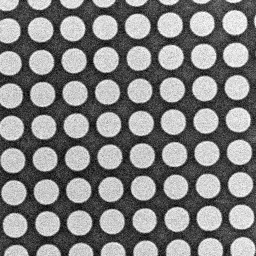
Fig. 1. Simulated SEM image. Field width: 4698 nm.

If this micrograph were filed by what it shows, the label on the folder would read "an array of small figures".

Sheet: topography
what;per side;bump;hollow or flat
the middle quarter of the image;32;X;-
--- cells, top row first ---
XXXXX---XXXXX---XXXXX----XXXX---
-XXX-----XXX--------------------
--------------------------------
--------------------------------
--XX-----XXX-----XXXX----XXXX---
XXXXX---XXXXX---XXXXXX--XXXXXX--
XXXXXX--XXXXXX--XXXXXX--XXXXXX--
XXXXXX--XXXXXX--XXXXXX--XXXXXX--
XXXXXX--XXXXX----XXXX----XXXX---
-XXXX----XXXX-----XX------------
--------------------------------
--------------------------------
----------XXX----XXXX----XXXXX--
-XXXX----XXXXX---XXXXX--XXXXXX--
XXXXXX--XXXXXX--XXXXXX--XXXXXX--
XXXXXX--XXXXXX--XXXXXX--XXXXXX--
XXXXXX---XXXXX---XXXXX---XXXXX--
-XXXX----XXXX-----XXX-----------
--------------------------------
--------------------------------
----------XXX-----XXX-----XXXX--
-XXXXX---XXXXX---XXXXX---XXXXX--
-XXXXX---XXXXX---XXXXXX--XXXXXX-
XXXXXX---XXXXX---XXXXX---XXXXXX-
XXXXXX---XXXXX---XXXXX---XXXXX--
-XXXXX----XXX-----XXX------XX---
---X----------------------------
--------------------------------
-----------XX-----XXX-----XXXX--
--XXXX---XXXXX---XXXXX---XXXXXX-
-XXXXX---XXXXXX--XXXXXX--XXXXXX-
-XXXXXX--XXXXXX--XXXXXX--XXXXXX-